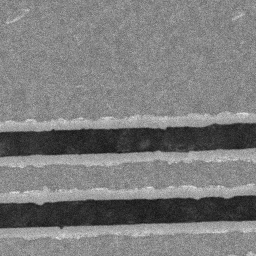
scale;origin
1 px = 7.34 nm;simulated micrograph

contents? one or a few lines or trenches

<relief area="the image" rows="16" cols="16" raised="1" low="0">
1111111111111111
1111111111111111
1111111111111111
1111111111111111
1111111111111111
1111111111111111
1111111111111111
1111111111111100
0000000000000000
0000000000000000
1111111111111111
1111111111111111
0000000000000000
0000000000000000
0000111111111111
1111111111111111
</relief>